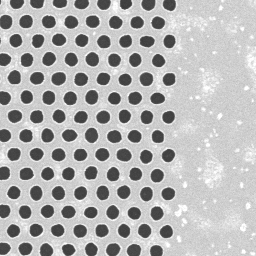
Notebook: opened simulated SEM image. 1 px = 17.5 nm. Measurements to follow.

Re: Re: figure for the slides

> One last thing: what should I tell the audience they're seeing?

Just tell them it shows a regular array of holes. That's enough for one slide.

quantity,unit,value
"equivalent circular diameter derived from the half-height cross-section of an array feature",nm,237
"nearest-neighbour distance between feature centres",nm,368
